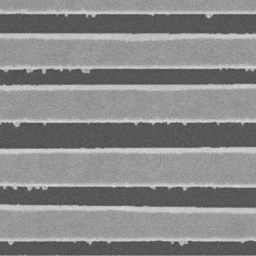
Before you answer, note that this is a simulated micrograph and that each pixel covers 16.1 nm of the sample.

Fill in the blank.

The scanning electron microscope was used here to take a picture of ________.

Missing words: lines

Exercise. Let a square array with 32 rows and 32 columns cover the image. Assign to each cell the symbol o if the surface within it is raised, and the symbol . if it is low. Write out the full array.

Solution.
oooooooooooooooooooooooooooooooo
oooooooooooooooooooooooooooooooo
................................
................................
................................
oooooooooooooooooooooooooooooooo
oooooooooooooooooooooooooooooooo
oooooooooooooooooooooooooooooooo
ooooooooooooo..oooo...o.........
................................
................................
oooooooooooooooooooooooooooooooo
oooooooooooooooooooooooooooooooo
oooooooooooooooooooooooooooooooo
oooooooooooooooooooooooooooooooo
................................
................................
................................
................................
oooooooooooooooooooooooooooooooo
oooooooooooooooooooooooooooooooo
oooooooooooooooooooooooooooooooo
oooooooooooooooooooooooooooooooo
................................
................................
................................
oooooooooooooooooooooooooooooooo
oooooooooooooooooooooooooooooooo
oooooooooooooooooooooooooooooooo
oooooooooooooooooooooooooooooooo
................................
................................